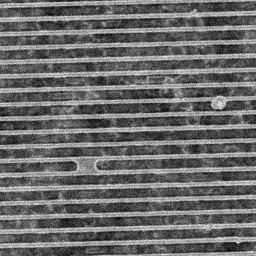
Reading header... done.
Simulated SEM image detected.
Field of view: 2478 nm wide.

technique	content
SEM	parallel lines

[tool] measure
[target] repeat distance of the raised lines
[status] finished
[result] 137 nm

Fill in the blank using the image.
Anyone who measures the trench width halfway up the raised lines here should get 102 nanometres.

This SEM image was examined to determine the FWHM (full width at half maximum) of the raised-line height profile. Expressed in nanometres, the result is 36.3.